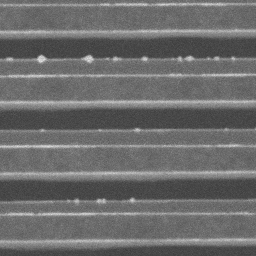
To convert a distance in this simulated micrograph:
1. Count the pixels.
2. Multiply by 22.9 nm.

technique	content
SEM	lines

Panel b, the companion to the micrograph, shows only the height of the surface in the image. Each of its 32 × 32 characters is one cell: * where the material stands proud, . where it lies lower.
********************************
********************************
********************************
********************************
................................
................................
................................
**..***.************************
********************************
********************************
********************************
********************************
********************************
................................
................................
................................
********************************
********************************
********************************
********************************
********************************
********************************
................................
................................
................................
********************************
********************************
********************************
********************************
********************************
................................
................................